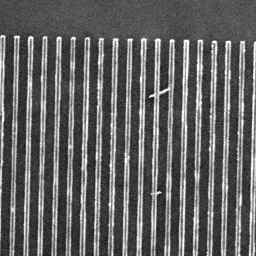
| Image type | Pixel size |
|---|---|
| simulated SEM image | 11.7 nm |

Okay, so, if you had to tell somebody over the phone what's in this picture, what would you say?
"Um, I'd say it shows parallel lines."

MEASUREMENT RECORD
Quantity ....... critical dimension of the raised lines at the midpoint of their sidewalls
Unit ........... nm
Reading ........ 43.7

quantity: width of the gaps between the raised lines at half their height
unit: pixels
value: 10.2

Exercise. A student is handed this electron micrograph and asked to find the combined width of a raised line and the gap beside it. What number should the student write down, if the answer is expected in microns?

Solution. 0.165